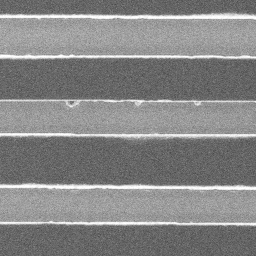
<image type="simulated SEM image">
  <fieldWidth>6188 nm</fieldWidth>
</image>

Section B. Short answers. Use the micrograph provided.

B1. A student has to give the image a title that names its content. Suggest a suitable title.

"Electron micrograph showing lines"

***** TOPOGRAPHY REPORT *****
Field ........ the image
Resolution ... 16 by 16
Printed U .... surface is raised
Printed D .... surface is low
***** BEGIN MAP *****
UUUUUUUUUUUUUUUU
DDDDDDDDDDDDDDDD
DDDDDDDDDDDDDDDD
DDDDDDDDDDDDDDDD
UUUUUUUUUUUUUUUU
UUUUUUUUUUUUUUUU
DDDDDDDDDDDDDDDD
DDDDDDDDDDDDDDDD
UUUUUUUUUUUUUUUU
UUUUUUUUUUUUUUUU
UUUUUUUUUUUUUUUU
UUUUUUUUUUUUUUUU
DDDDDDDDDDDDDDDD
DDDDDDDDDDDDDDDD
UUUUUUUUUUUUUUUU
UUUUUUUUUUUUUUUU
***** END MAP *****